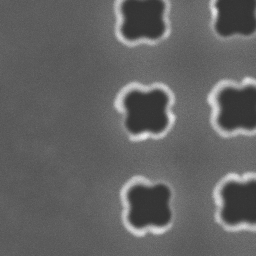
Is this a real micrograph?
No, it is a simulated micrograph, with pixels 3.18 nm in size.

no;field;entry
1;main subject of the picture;holes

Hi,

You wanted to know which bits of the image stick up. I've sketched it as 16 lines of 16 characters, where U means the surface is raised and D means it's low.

UUUUUUUUDDUUUUDD
UUUUUUUUDDUUUUDD
UUUUUUUUUUUUUUUU
UUUUUUUUUUUUUUUU
UUUUUUUUUUUUUUUU
UUUUUUUUUUUUUUUD
UUUUUUUUDDUUUUDD
UUUUUUUUDDUUUUDD
UUUUUUUUUUUUUUUU
UUUUUUUUUUUUUUUU
UUUUUUUUUUUUUUUU
UUUUUUUUUUUUUUDD
UUUUUUUUDDDUUUDD
UUUUUUUUDDDUUUDD
UUUUUUUUUUUUUUUU
UUUUUUUUUUUUUUUU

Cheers